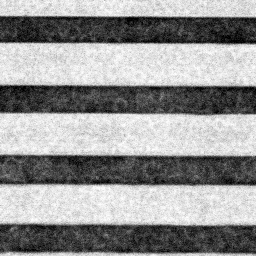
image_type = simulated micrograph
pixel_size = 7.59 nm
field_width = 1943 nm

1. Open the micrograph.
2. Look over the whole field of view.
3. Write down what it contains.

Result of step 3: one or a few lines or trenches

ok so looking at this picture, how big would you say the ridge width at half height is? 313 nm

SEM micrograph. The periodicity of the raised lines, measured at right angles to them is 532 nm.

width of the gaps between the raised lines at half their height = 215 nm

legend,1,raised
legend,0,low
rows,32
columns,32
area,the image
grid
11111111111111111111111111111111
11111111111111111111111111111111
00000000000000000000000000000000
00000000000000000000000000000000
00000000000000000000000000000000
11111111111110000000000000000000
11111111111111111111111111111111
11111111111111111111111111111111
11111111111111111111111111111111
11111111111111111111111111111111
11111111111111111111111111111111
00000000000000000000000000000000
00000000000000000000000000000000
00000000000000000000000000000000
11111111111111111111111111111111
11111111111111111111111111111111
11111111111111111111111111111111
11111111111111111111111111111111
11111111111111111111111111111111
00000000000000000000000000000000
00000000000000000000000000000000
00000000000000000000000000000000
00000000000000000000000000000000
11111111111111111111111111111111
11111111111111111111111111111111
11111111111111111111111111111111
11111111111111111111111111111111
11111111111111111111111111111111
00000000000000000000000000000000
00000000000000000000000000000000
00000000000000000000000000000000
00000000000000000000000000000000